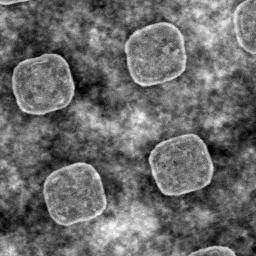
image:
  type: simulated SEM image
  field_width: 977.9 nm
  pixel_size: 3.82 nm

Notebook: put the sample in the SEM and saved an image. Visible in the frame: raised bodies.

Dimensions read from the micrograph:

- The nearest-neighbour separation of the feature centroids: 112 pixels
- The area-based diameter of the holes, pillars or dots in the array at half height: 233 nm